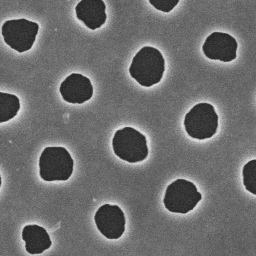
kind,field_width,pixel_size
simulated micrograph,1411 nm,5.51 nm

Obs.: a regular array of holes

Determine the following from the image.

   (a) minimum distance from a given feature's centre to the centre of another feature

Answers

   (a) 413 nanometers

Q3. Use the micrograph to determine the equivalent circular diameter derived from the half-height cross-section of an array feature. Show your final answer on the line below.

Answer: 191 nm